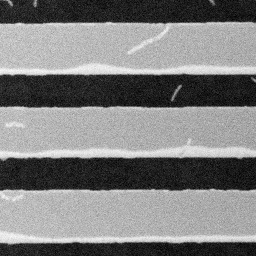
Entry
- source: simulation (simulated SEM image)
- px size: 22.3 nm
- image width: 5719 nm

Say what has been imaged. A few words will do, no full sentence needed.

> lines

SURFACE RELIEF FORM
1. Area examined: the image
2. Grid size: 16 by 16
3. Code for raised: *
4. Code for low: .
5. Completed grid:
................
.***************
****************
****************
*****..****.....
................
................
****************
****************
****************
................
................
****************
****************
****************
................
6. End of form